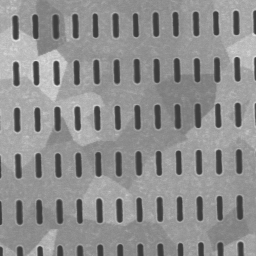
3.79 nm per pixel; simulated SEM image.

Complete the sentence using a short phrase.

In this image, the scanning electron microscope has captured a regular array of holes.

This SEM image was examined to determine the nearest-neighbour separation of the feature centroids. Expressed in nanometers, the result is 75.